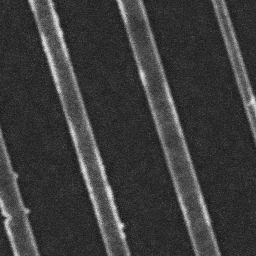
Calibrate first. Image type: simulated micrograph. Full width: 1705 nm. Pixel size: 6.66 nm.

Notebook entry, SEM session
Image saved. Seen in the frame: one or a few lines or trenches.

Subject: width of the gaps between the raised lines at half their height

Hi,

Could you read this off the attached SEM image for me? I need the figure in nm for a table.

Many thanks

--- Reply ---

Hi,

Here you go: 434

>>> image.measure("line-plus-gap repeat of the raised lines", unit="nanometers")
568